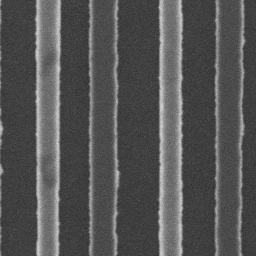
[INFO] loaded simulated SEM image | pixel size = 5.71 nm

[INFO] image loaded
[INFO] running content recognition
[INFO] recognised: lines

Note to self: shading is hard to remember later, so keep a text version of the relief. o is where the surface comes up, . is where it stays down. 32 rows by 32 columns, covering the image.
.....oo....oooo.....ooo....ooo..
.....oo....oooo.....ooo....ooo..
.....oo....oooo.....ooo....ooo..
.....oo....oooo.....ooo....ooo..
.....oo....oooo.....ooo....ooo..
.....oo....oooo.....ooo....ooo..
.....oo....oooo.....ooo....ooo..
.....oo....oooo.....ooo....ooo..
.....oo....oooo.....ooo....ooo..
.....oo....oooo.....ooo....ooo..
.....oo....oooo.....ooo....ooo..
.....oo....oooo.....ooo....ooo..
.....oo....oooo.....ooo....ooo..
.....oo....oooo.....ooo....ooo..
.....oo....oooo.....ooo....ooo..
.....oo....oooo.....ooo....ooo..
.....oo....oooo.....ooo....ooo..
.....oo....oooo.....ooo....ooo..
.....oo....oooo.....ooo....ooo..
.....oo....oooo.....ooo....ooo..
.....oo....oooo.....ooo....ooo..
.....oo....oooo.....ooo....ooo..
.....oo....oooo.....ooo....ooo..
.....oo....oooo.....ooo....ooo..
.....oo....oooo.....ooo....ooo..
.....oo....oooo.....ooo....ooo..
.....oo....oooo.....ooo....ooo..
.....oo....ooo......ooo....ooo..
.....oo....ooo......ooo....ooo..
.....oo....ooo......ooo....ooo..
.....oo....oooo.....ooo....ooo..
.....oo....oooo.....ooo....ooo..